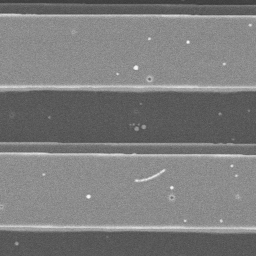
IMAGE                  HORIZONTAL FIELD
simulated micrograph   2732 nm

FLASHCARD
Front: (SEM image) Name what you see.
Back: lines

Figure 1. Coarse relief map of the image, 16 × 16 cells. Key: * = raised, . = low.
****************
****************
****************
****************
****************
................
................
................
................
****************
****************
****************
****************
****************
................
................